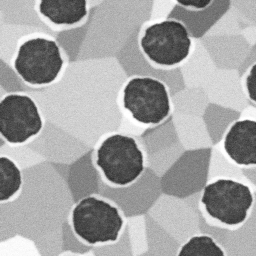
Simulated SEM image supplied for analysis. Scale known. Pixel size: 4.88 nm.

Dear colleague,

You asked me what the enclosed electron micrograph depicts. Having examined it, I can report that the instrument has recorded holes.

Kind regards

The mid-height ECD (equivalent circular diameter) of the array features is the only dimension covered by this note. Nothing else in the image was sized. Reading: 0.238 micrometres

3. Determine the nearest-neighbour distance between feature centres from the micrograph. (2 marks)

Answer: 0.315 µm